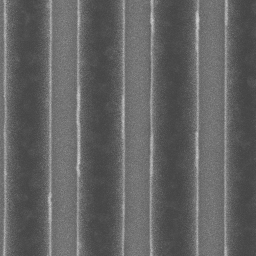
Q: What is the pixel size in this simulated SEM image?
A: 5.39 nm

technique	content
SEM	one or a few lines or trenches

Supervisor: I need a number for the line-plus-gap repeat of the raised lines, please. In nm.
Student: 395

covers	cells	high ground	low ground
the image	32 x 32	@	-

-@@@@@----@@@@@@---@@@@@@---@@@@
-@@@@@----@@@@@@---@@@@@@---@@@@
-@@@@@----@@@@@@---@@@@@@---@@@@
-@@@@@----@@@@@@---@@@@@@---@@@@
-@@@@@----@@@@@@---@@@@@@---@@@@
-@@@@@----@@@@@@---@@@@@@---@@@@
-@@@@@----@@@@@----@@@@@@---@@@@
-@@@@@----@@@@@----@@@@@@---@@@@
-@@@@@----@@@@@@---@@@@@@---@@@@
-@@@@@----@@@@@@---@@@@@@---@@@@
-@@@@@----@@@@@@---@@@@@@---@@@@
-@@@@@----@@@@@@---@@@@@@---@@@@
-@@@@@----@@@@@@---@@@@@@---@@@@
-@@@@@----@@@@@@---@@@@@@---@@@@
-@@@@@----@@@@@@---@@@@@@---@@@@
-@@@@@----@@@@@@---@@@@@@---@@@@
-@@@@@----@@@@@@---@@@@@@---@@@@
-@@@@@----@@@@@@---@@@@@@---@@@@
-@@@@@----@@@@@@---@@@@@@---@@@@
-@@@@@----@@@@@----@@@@@@---@@@@
-@@@@@----@@@@@----@@@@@@---@@@@
-@@@@@----@@@@@----@@@@@@---@@@@
-@@@@@----@@@@@----@@@@@@---@@@@
-@@@@@----@@@@@----@@@@@@---@@@@
-@@@@@----@@@@@----@@@@@@---@@@@
-@@@@@----@@@@@----@@@@@@---@@@@
-@@@@@----@@@@@----@@@@@@---@@@@
-@@@@@----@@@@@----@@@@@@---@@@@
-@@@@@----@@@@@----@@@@@@---@@@@
-@@@@@----@@@@@----@@@@@@---@@@@
-@@@@@----@@@@@----@@@@@@---@@@@
@@@@@@----@@@@@----@@@@@@---@@@@